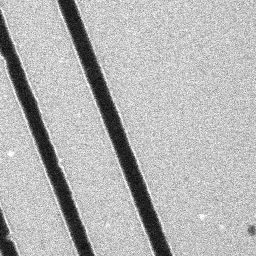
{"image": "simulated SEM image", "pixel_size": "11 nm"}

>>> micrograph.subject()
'one or a few lines or trenches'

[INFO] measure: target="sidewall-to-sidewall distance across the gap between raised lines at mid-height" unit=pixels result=53.1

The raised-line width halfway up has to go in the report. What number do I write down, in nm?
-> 204